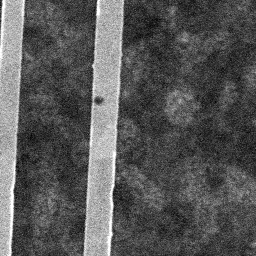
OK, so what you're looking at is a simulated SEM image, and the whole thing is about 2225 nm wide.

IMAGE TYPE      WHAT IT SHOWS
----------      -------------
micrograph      one or a few lines or trenches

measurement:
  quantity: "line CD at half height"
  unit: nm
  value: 221